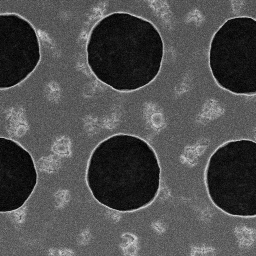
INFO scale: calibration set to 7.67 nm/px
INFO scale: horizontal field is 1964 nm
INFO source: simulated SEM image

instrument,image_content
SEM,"holes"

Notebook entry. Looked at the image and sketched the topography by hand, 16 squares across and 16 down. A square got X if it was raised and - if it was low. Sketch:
XXXXXXXXXXXXXXXX
--XXXX---XXXXX--
--XXXX----XXX---
--XXX-----XXX---
--XXXX----XXX---
XXXXXXX--XXXXX--
XXXXXXXXXXXXXXXX
XXXXXXXXXXXXXXXX
XXXXXXX-XXXXXXXX
--XXXX----XXXX--
--XXXX----XXX---
--XXXX----XXX---
--XXXX---XXXX---
XXXXXXXXXXXXXXXX
XXXXXXXXXXXXXXXX
XXXXXXXXXXXXXXXX